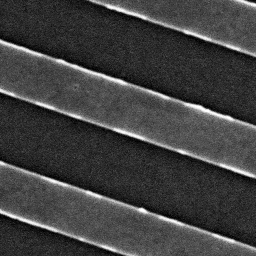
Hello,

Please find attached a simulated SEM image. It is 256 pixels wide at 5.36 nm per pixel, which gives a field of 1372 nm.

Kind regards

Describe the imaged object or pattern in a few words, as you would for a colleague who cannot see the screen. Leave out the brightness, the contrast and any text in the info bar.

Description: one or a few lines or trenches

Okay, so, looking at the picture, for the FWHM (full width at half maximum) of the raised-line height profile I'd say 261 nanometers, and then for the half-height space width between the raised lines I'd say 355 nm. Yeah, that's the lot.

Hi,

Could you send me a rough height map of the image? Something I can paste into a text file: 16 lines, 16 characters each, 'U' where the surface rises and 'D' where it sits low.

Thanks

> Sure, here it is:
DDDDDDDUUUUUUUUU
DDDDDDDDDDUUUUUU
DDDDDDDDDDDDDUUU
UUUDDDDDDDDDDDDD
UUUUUUDDDDDDDDDD
UUUUUUUUUDDDDDDD
DDUUUUUUUUUUDDDD
DDDDDUUUUUUUUUUD
DDDDDDDDUUUUUUUU
DDDDDDDDDDDUUUUU
UDDDDDDDDDDDDDUU
UUUUDDDDDDDDDDDD
UUUUUUUDDDDDDDDD
DUUUUUUUUUDDDDDD
DDDDUUUUUUUUUDDD
DDDDDDDUUUUUUUUU